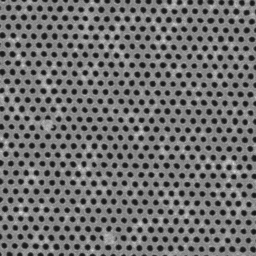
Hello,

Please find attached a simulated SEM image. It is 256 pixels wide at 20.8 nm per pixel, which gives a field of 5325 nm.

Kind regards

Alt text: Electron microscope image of a regular array of holes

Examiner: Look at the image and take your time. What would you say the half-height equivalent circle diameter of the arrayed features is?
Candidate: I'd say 129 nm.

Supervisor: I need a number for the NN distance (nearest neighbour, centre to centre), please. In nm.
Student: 206